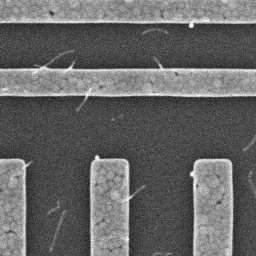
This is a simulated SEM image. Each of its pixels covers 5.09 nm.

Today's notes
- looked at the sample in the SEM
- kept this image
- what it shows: groups of lines, slits or small figures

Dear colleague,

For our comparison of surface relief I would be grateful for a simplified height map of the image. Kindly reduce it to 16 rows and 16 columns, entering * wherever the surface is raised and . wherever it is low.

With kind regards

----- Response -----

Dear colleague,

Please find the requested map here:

****************
................
................
................
****************
****************
................
................
................
................
**....**....**..
*.....**....**..
**....**....**..
**....**....**..
**....**....**..
**....**....**..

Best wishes